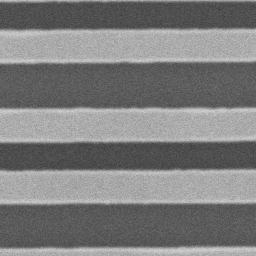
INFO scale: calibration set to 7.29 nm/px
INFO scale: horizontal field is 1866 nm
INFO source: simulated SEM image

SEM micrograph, lines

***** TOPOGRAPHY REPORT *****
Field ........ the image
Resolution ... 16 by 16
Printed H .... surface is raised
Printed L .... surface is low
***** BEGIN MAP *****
LLLLLLLLLLLLLLLL
LLLLLLLLLLLLLLLL
HHHHHHHHHHHHHHHH
HHHHHHHHHHHHHHHH
LLLLLLLLLLLLLLLL
LLLLLLLLLLLLLLLL
LLLLLLLLLLLLLLLL
HHHHHHHHHHHHHHHH
HHHHHHHHHHHHHHHH
LLLLLLLLLLLLLLLL
LLLLLLLLLLLLLLLL
HHHHHHHHHHHHHHHH
HHHHHHHHHHHHHHHH
LLLLLLLLLLLLLLLL
LLLLLLLLLLLLLLLL
LLLLLLLLLLLLLLHH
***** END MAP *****